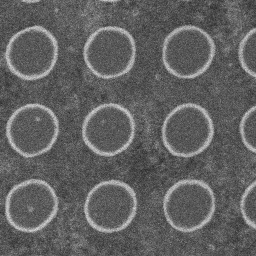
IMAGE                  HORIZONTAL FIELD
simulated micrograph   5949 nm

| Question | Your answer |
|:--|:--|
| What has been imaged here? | a regular array of raised bodies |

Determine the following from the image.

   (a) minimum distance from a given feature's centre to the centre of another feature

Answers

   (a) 1770 nm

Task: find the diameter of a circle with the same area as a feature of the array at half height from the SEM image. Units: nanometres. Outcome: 1140